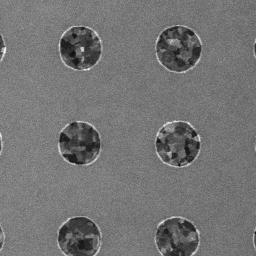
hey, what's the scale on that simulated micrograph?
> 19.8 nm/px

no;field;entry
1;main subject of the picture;raised bodies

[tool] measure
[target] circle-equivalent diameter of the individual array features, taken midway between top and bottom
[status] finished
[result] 883 nm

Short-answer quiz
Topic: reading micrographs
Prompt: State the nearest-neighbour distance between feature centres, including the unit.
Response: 1.89 µm